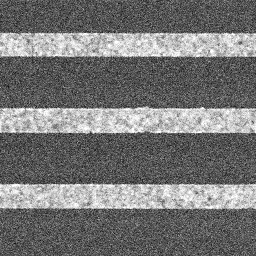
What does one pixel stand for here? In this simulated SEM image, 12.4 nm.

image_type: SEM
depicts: one or a few lines or trenches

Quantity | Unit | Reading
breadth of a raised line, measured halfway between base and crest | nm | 287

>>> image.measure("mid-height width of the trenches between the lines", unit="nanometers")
654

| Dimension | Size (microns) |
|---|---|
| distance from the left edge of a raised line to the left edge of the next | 0.942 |